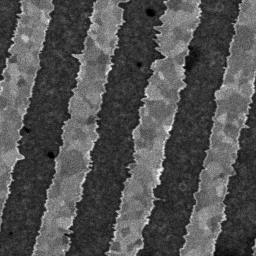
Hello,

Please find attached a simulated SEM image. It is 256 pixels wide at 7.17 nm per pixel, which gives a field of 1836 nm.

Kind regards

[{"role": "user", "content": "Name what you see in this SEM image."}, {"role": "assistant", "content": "one or a few lines or trenches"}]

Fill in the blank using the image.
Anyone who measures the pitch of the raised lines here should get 511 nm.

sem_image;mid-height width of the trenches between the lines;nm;292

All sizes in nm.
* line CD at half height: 219